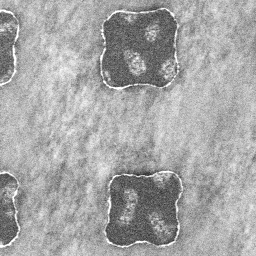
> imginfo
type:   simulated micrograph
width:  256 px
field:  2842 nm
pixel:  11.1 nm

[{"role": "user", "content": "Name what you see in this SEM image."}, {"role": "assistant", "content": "raised bodies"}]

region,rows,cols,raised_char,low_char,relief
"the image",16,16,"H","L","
LLLLLLLLLLLLLLLL
HLLLLLLHHHHLLLLL
HLLLLLHHHHHLLLLL
HLLLLLHHHHHLLLLL
HLLLLLHHHHHLLLLL
LLLLLLLHLLLLLLLL
LLLLLLLLLLLLLLLL
LLLLLLLLLLLLLLLL
LLLLLLLLLLLLLLLL
LLLLLLLLLLLLLLLL
LLLLLLLLLLLLLLLL
HLLLLLLHHHHLLLLL
HLLLLLLHHHHLLLLL
HLLLLLLHHHHLLLLL
HLLLLLLHHHHLLLLL
LLLLLLLLLLLLLLLL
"